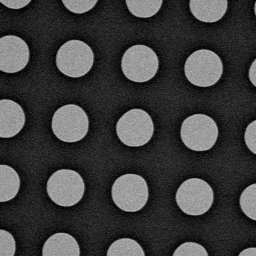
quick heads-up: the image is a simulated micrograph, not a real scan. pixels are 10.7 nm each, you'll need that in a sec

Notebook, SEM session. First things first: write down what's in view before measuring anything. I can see an array of small figures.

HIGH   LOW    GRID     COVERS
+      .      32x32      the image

+++.....++++....++++....++++....
.........++.....++++....++++....
.........................++.....
................................
.+..............................
+++.....+++.....................
++++...++++.....+++.....+++.....
++++...+++++...+++++...+++++....
+++....++++....+++++...+++++...+
.........+......+++....+++++...+
........................+++.....
................................
+...............................
+++.....++......................
+++....++++....++++.....++......
+++....++++....++++....++++....+
++.....++++....++++....++++....+
........++.....++++....++++....+
........................++.....+
................................
................................
++.....++.......................
++....++++.....+++......+.......
++....++++....++++....++++.....+
++....++++....++++....+++++...++
.......++.....++++....++++....++
.......................+++....++
................................
................................
+......++.......................
++....++++....+++......++.......
++...+++++...+++++....++++....++